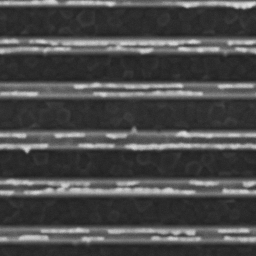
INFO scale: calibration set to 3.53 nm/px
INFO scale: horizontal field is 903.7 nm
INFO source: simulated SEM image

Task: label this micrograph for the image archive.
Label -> parallel lines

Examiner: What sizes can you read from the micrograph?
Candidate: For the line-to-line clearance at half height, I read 30.6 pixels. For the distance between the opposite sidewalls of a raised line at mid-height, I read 16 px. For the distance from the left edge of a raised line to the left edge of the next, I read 0.167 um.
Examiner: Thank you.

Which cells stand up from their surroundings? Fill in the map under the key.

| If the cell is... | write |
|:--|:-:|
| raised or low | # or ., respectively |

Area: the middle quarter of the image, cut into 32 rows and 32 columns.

................................
................................
................................
................................
................................
################################
################################
################################
................................
................................
................................
................................
................................
................................
................................
................................
.................#..............
################################
################################
################################
################################
.................#.#............
................................
................................
................................
................................
................................
................................
................................
################################
################################
################################